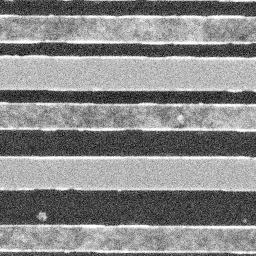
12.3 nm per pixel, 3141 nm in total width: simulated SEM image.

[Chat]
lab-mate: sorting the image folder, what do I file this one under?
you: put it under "lines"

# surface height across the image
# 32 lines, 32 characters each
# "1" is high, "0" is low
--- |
00000000000000000000000000000000
00000000000000000000000000000000
11111111111111111111111111111111
11111111111111111111111111111111
11111111111111111111111111111111
00000000000000000000000000000000
00000000000000000000000000000000
11111111111111111111111111111111
11111111111111111111111111111111
11111111111111111111111111111111
11111111111111111111111111111111
00000000000000000000000000000000
00000000000000000000000000000000
11111111111111111111111111111111
11111111111111111111111111111111
11111111111111111111111111111111
00000000000000000000000000000000
00000000000000000000000000000000
00000000000000000000000000000000
00000000000000000000000000000000
11111111111111111111111111111111
11111111111111111111111111111111
11111111111111111111111111111111
11111111111111111111111111111111
00000000000000000000000000000000
00000000000000000000000000000000
00000000000000000000000000000000
00000000000000000000000000000000
11111111111111111111111111111111
11111111111111111111111111111111
11111111111111111111111111111111
00000000000000000000000000000111